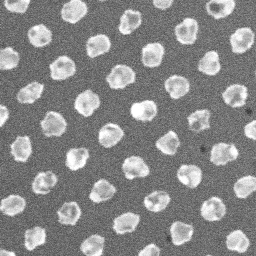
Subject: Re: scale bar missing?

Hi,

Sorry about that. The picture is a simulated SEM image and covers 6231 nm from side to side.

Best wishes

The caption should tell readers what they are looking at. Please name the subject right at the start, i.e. a regular array of raised bodies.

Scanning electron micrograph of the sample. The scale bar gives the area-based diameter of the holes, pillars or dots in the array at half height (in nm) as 523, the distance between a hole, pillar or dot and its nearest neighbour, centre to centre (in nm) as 967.